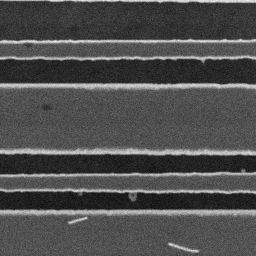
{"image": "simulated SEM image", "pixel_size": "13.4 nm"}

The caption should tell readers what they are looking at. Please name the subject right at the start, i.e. lines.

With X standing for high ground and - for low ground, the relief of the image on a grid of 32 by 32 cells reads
--------------------------------
--------------------------------
--------------------------------
--------------------------------
--------------------------------
XXXXXXXXXXXXXXXXXXXXXXXXXXXXXXXX
XXXXXXXXXXXXXXXXXXXXXXXXXXXXXXXX
----------XX--------------------
--------------------------------
--------------------------------
--------------------------------
XXXXXXXXXXXXXXXXXXXXXXXXXXXXXXXX
XXXXXXXXXXXXXXXXXXXXXXXXXXXXXXXX
XXXXXXXXXXXXXXXXXXXXXXXXXXXXXXXX
XXXXXXXXXXXXXXXXXXXXXXXXXXXXXXXX
XXXXXXXXXXXXXXXXXXXXXXXXXXXXXXXX
XXXXXXXXXXXXXXXXXXXXXXXXXXXXXXXX
XXXXXXXXXXXXXXXXXXXXXXXXXXXXXXXX
XXXXXXXXXXXXXXXXXXXXXXXXXXXXXXXX
--------------------------------
--------------------------------
--------------------------------
XXXXXXXXXXXXXXXXXXXXXXXXXXXXXXXX
XXXXXXXXXXXXXXXXXXXXXXXXXXXXXXXX
--------------------------------
--------------------------------
XXXXXXXXXXXXXXXXXXXXXXXXXXXXXXXX
XXXXXXXXXXXXXXXXXXXXXXXXXXXXXXXX
XXXXXXXXXXXXXXXXXXXXXXXXXXXXXXXX
XXXXXXXXXXXXXXXXXXXXXXXXXXXXXXXX
XXXXXXXXXXXXXXXXXXXXXXXXXXXXXXXX
XXXXXXXXXXXXXXXXXXXXXXXXXXXXXXXX